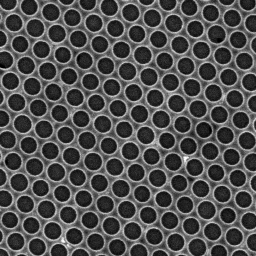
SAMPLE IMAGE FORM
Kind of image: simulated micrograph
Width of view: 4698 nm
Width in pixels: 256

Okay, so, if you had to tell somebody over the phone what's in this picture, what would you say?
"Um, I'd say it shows a regular array of holes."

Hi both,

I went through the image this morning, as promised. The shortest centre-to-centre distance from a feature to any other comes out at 21.9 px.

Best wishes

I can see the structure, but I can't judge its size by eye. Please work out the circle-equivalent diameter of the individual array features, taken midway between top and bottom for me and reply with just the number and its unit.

0.32 um